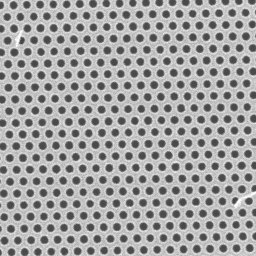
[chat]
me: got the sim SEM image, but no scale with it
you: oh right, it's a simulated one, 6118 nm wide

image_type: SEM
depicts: a regular array of holes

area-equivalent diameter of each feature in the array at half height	204	nm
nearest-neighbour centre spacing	308	nanometres